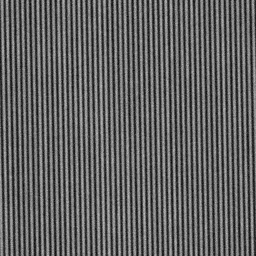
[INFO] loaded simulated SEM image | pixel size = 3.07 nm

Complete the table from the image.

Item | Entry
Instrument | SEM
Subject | parallel lines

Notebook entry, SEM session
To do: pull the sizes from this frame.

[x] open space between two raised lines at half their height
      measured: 2.87 pixels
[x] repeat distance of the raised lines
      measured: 15.7 nm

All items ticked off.